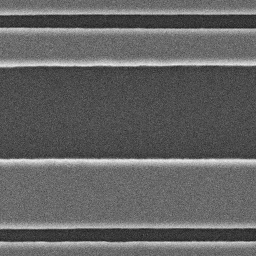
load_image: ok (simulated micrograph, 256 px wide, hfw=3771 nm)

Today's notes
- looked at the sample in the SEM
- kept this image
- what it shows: lines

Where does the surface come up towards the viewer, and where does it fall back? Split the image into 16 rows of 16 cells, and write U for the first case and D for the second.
UUUUUUUUUUUUUUUU
UUUUUUUUUUUUUUUU
UUUUUUUUUUUUUUUU
UUUUUUUUUUUUUUUU
DDDDDDDDDDDDDDDD
DDDDDDDDDDDDDDDD
DDDDDDDDDDDDDDDD
DDDDDDDDDDDDDDDD
DDDDDDDDDDDDDDDD
DDDDDDDDDDDDDDDD
UUUUUUUUUUUUUUUU
UUUUUUUUUUUUUUUU
UUUUUUUUUUUUUUUU
UUUUUUUUUUUUUUUU
UUUUUUUUUUUUUUUU
UUUUUUUUUUUUUUUU